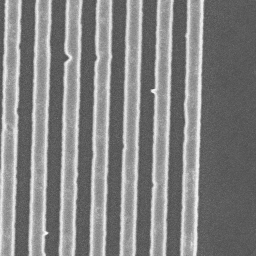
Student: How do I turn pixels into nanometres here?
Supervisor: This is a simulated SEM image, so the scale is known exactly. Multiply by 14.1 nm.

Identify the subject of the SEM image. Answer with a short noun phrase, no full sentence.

parallel lines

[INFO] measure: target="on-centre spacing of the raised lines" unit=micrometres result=0.428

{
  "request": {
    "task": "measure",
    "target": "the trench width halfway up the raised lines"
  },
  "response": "229 nm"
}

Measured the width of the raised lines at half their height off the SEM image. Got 0.201 µm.